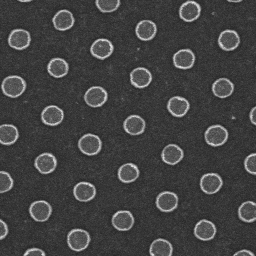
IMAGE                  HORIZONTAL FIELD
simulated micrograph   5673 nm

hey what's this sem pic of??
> a regular array of raised bodies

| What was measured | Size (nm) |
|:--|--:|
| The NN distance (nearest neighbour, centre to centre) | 1050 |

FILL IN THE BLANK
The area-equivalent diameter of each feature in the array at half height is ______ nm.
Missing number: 454